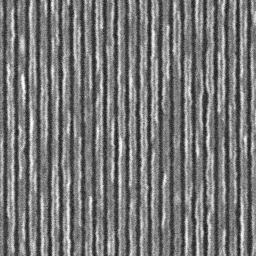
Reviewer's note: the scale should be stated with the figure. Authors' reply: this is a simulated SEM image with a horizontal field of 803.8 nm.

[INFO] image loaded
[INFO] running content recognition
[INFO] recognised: parallel lines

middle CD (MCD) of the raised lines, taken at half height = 19.2 nm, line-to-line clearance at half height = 15.3 nanometers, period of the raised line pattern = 34.8 nm